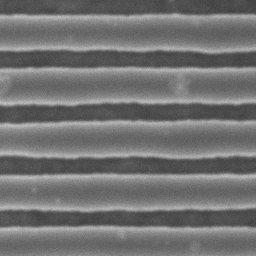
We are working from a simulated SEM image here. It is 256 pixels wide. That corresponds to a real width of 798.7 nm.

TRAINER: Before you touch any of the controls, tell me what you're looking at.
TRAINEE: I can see lines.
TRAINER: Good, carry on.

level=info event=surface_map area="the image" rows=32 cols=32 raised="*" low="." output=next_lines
................................
................................
********************************
********************************
********************************
********************************
.........................***....
................................
................................
********************************
********************************
********************************
********************************
................................
................................
**.*****************************
********************************
********************************
********************************
...**************************..*
................................
................................
********************************
********************************
********************************
********************************
................................
................................
..*..************.***..*.******.
********************************
********************************
********************************